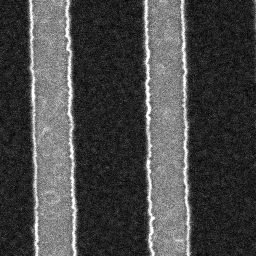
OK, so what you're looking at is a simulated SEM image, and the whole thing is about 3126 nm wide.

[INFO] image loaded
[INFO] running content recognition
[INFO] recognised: one or a few lines or trenches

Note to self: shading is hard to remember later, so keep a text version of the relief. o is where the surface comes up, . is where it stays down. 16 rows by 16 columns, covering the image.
oo..ooooo..ooooo
oo..ooooo..ooooo
oo..ooooo..ooooo
oo..ooooo..ooooo
oo..ooooo...oooo
oo..ooooo..ooooo
oo..ooooo...oooo
oo..ooooo...oooo
oo..ooooo...oooo
oo..ooooo...oooo
oo...oooo...oooo
oo...oooo...oooo
oo...oooo...oooo
oo...oooo...oooo
oo...oooo...oooo
oo...oooo...oooo